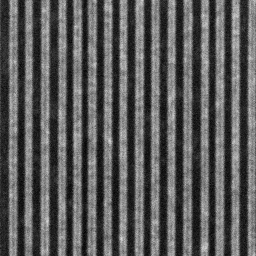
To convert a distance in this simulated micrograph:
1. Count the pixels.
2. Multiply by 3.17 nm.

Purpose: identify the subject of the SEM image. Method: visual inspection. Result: parallel lines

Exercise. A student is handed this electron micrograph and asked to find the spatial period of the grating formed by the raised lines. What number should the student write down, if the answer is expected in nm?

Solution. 50.4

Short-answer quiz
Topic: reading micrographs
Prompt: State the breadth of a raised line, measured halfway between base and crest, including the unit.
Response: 17.4 nanometres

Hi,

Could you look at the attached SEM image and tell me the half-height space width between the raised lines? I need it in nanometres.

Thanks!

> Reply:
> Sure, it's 31.7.